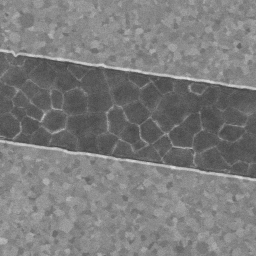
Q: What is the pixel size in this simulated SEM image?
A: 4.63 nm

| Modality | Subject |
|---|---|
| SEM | one or a few lines or trenches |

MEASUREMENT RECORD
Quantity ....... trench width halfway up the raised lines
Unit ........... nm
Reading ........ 416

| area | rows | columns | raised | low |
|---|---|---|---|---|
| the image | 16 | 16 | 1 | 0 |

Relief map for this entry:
1111111111111111
1111111111111111
1111111111111111
0011111111111111
0000000001111111
0000000000000001
0000000000000000
0000000000000000
0000000000000000
1111000000000000
1111111111100000
1111111111111111
1111111111111111
1111111111111111
1111111111111111
1111111111111111